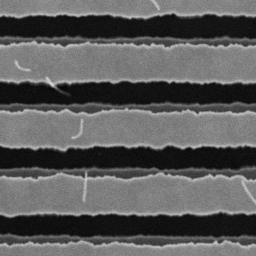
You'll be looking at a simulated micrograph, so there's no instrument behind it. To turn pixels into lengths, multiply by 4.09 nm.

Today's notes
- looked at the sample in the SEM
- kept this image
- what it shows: lines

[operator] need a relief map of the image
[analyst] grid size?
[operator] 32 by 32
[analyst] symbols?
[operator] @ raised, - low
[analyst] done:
@@@@@@@@@@@@@@@@@@@@@@@@@@@@@@@@
@@@@@@@@@@@@@@@@@@@@@@@@@@@@@@@@
--------------------------------
--------------------------------
--------------------------------
@@@@@@@@@@@@@@@@@@@@@@@@@@@@@@@@
@@@@@@@@@@@@@@@@@@@@@@@@@@@@@@@@
@@@@@@@@@@@@@@@@@@@@@@@@@@@@@@@@
@@@@@@@@@@@@@@@@@@@@@@@@@@@@@@@@
@@@@@@@@@@@@@@@@@@@@@@@@@@@@@@@@
------@@@----------------@-@@---
--------------------------------
--------------------------------
@@@@@@@@@@@@@@@@@@@@@@@@@@@@@@@@
@@@@@@@@@@@@@@@@@@@@@@@@@@@@@@@@
@@@@@@@@@@@@@@@@@@@@@@@@@@@@@@@@
@@@@@@@@@@@@@@@@@@@@@@@@@@@@@@@@
@@@@@@@@@@@@@@@@@@@@@@@@@@@@@@@@
----@-@@@-@--------@--@---------
--------------------------------
--------------------------------
@@@@@@@@@@@@@@@@@@@@@@@@@@@@@@@@
@@@@@@@@@@@@@@@@@@@@@@@@@@@@@@@@
@@@@@@@@@@@@@@@@@@@@@@@@@@@@@@@@
@@@@@@@@@@@@@@@@@@@@@@@@@@@@@@@@
@@@@@@@@@@@@@@@@@@@@@@@@@@@@@@@@
@@@@@@@@@@@@@@@@@@@@@@@@@@@@@@@@
--------------------------------
--------------------------------
@@--@@@@@--------@@@----------@-
@@@@@@@@@@@@@@@@@@@@@@@@@@@@@@@@
@@@@@@@@@@@@@@@@@@@@@@@@@@@@@@@@